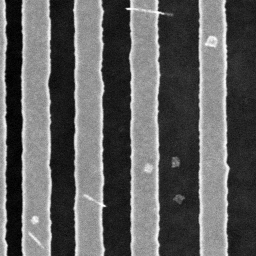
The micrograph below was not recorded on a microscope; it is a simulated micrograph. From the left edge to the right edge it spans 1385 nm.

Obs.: lines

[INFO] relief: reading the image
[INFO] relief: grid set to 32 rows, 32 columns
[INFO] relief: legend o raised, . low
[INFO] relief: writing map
o..ooo...oooo...oooo.....ooo....
o..ooo...oooo...oooo.....ooo....
o..ooo...oooo...oooo.....ooo....
o..ooo...oooo...oooo.....ooo....
o..ooo...oooo...oooo.....ooo....
o..ooo...oooo...oooo.....ooo....
o..ooo...oooo...oooo.....ooo....
o..ooo...oooo...oooo.....ooo....
o..ooo...oooo...oooo.....ooo....
o..ooo...oooo...oooo.....ooo....
o..ooo...oooo...oooo.....ooo....
o..ooo...oooo...oooo.....ooo....
o..ooo...oooo...oooo.....ooo....
o..ooo...oooo...oooo.....ooo....
o..ooo...oooo...oooo.....ooo....
o..ooo...oooo...oooo.....ooo....
o..ooo...oooo...oooo.....ooo....
o..ooo...oooo...oooo.....ooo....
o..ooo...oooo...oooo.....ooo....
o..ooo...oooo...oooo.....ooo....
o..ooo...oooo...oooo.....ooo....
o..ooo...oooo...oooo.....oooo...
o..ooo...oooo...oooo.....ooo....
o..ooo...oooo...oooo.....ooo....
o..ooo...oooo...oooo.....ooo....
o..ooo...oooo...oooo.....ooo....
o..ooo...oooo...oooo.....ooo....
o..ooo...oooo...oooo.....ooo....
o..ooo...oooo...oooo.....ooo....
o..ooo...oooo...oooo.....ooo....
o..ooo...oooo...oooo.....ooo....
o..ooo...oooo...oooo.....ooo....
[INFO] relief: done